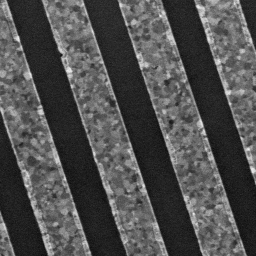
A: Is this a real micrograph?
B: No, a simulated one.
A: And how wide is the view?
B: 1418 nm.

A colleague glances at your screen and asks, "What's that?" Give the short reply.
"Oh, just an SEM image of one or a few lines or trenches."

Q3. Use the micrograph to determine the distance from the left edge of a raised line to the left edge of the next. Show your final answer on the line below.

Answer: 406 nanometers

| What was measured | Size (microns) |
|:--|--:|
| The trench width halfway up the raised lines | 0.191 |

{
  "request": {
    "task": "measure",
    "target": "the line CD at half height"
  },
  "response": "220 nanometres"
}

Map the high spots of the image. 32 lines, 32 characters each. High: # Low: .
#....#####.....#####.....#####..
#.....#####....######....#####..
##....#####.....#####....######.
##.....####.....#####.....#####.
##.....#####....######....#####.
###....#####.....#####....######
###.....####.....#####.....#####
###.....#####....######....#####
####....#####.....#####....#####
####....#####.....#####.....####
####.....#####....######....####
#####....#####.....#####....####
#####.....####.....#####.....###
#####.....#####....######....###
######....#####.....#####....###
.#####.....####.....#####.....##
.#####.....#####....######....##
.######....#####.....#####....##
..#####.....####.....#####.....#
..#####.....#####....######....#
..######....#####.....#####....#
...#####.....####.....#####.....
...#####.....#####....######....
...######....#####.....#####....
....#####.....####.....#####....
....#####.....#####....######...
....######....#####.....#####...
.....#####....#####.....#####...
#....#####.....#####....######..
#....######....#####.....#####..
#.....#####.....####.....#####..
##....#####.....#####....######.